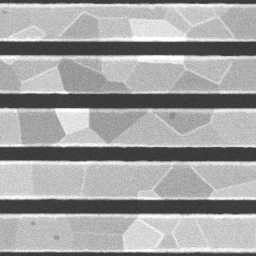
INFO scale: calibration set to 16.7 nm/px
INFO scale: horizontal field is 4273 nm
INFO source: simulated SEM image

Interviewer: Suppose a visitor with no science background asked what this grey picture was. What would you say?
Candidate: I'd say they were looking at lines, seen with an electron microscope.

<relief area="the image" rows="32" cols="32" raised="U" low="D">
UUUUUDDUDUUUDDDDDDDDDUUUDDUUDDDD
UUUUUUUUUUUUUUUUUUUUUUUUUUUUUUUU
UUUUUUUUUUUUUUUUUUUUUUUUUUUUUUUU
UUUUUUUUUUUUUUUUUUUUUUUUUUUUUUUU
UUUUUUUUUUUUUUUUUUUUUUUUUUUUUUUU
DDDDDDDDDDDDDDDDDDDDDDDDDDDDDDDD
DDDDDDDDDDDDDDDDDDDDDDDDDDDDDDDD
UUUUUUUUUUUUUUUUUUUUUUUUUUUUUUUU
UUUUUUUUUUUUUUUUUUUUUUUUUUUUUUUU
UUUUUUUUUUUUUUUUUUUUUUUUUUUUUUUU
UUUUUUUUUUUUUUUUUUUUUUUUUUUUUUUU
UUUUUUUUUUUUUUUUUUUUUUUUUUUUUUUU
DDDDDDDDDDDDDDDDDDDDDDDDDDDDDDDD
DDDDDDDDDDDDDDDDDDDDDDDDDDDDDDDD
UUUUUUUUUUUUUUUUUUUUUUUUUUUUUUUU
UUUUUUUUUUUUUUUUUUUUUUUUUUUUUUUU
UUUUUUUUUUUUUUUUUUUUUUUUUUUUUUUU
UUUUUUUUUUUUUUUUUUUUUUUUUUUUUUUU
DDDDDDDDDDDDDDDDDDDDDDDDDDDDDDDD
DDDDDDDDDDDDDDDDDDDDDDDDDDDDDDDD
UUUUUUUUUUUUUUUUUUUUUUUUUUUUUUUU
UUUUUUUUUUUUUUUUUUUUUUUUUUUUUUUU
UUUUUUUUUUUUUUUUUUUUUUUUUUUUUUUU
UUUUUUUUUUUUUUUUUUUUUUUUUUUUUUUU
UUUUUUUUUUUUUUUUUUUUUUUUUUUUUUUU
DDDDDDDDDDDDDDDDDDDDDDDDDDDDDDDD
DDDDDDDDDDDDDDDDDDDDDDDDDDDDDDDD
UUUUUUUUUUUUUUUUUUUUUUUUUUUUUUUU
UUUUUUUUUUUUUUUUUUUUUUUUUUUUUUUU
UUUUUUUUUUUUUUUUUUUUUUUUUUUUUUUU
UUUUUUUUUUUUUUUUUUUUUUUUUUUUUUUU
DDDDDDDDDDDDDDDDDDDDDDDDDDDDDUDU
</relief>